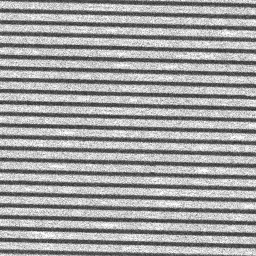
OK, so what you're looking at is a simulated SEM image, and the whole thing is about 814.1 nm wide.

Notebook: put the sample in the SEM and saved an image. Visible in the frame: parallel lines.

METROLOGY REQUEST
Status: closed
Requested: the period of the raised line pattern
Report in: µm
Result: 0.0364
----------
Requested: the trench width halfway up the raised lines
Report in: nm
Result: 11.9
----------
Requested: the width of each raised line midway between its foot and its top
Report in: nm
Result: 23.8